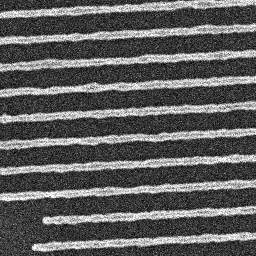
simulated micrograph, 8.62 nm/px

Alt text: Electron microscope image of parallel lines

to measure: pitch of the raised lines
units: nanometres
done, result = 224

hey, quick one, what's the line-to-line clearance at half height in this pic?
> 178 nanometers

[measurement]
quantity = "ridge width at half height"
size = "46.3 nanometers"